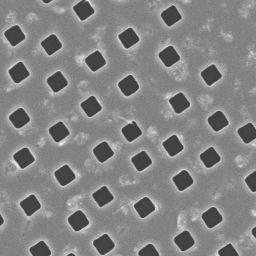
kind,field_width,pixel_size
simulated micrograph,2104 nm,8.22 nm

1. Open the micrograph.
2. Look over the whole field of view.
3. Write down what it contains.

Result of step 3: a regular array of holes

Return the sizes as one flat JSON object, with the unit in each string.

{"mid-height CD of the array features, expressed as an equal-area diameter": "157 nm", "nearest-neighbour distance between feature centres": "309 nm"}